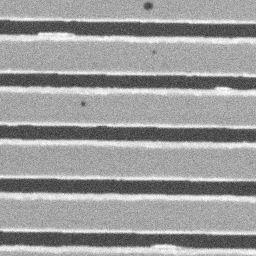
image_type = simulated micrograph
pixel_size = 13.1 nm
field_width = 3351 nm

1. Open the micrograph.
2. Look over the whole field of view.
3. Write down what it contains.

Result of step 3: lines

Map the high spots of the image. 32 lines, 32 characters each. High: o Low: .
oooooooooooooooooooooooooooooooo
oooooooooooooooooooooooooooooooo
..........oooooooooooooooooooooo
................................
................................
oooooooooooooooooooooooooooooooo
oooooooooooooooooooooooooooooooo
oooooooooooooooooooooooooooooooo
oooooooooooooooooooooooooooooooo
...............................o
................................
ooooooooooooooooooooooooo..o....
oooooooooooooooooooooooooooooooo
oooooooooooooooooooooooooooooooo
oooooooooooooooooooooooooooooooo
oooooooooooooooooooooooooooooooo
................................
................................
oooooooooooooooooooooooooooooooo
oooooooooooooooooooooooooooooooo
oooooooooooooooooooooooooooooooo
oooooooooooooooooooooooooooooooo
..........................oooooo
................................
oooooooo........................
oooooooooooooooooooooooooooooooo
oooooooooooooooooooooooooooooooo
oooooooooooooooooooooooooooooooo
oooooooooooooooooooooooooooooooo
................................
................................
oooooooooooooooooooooooooooooooo